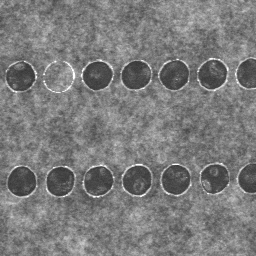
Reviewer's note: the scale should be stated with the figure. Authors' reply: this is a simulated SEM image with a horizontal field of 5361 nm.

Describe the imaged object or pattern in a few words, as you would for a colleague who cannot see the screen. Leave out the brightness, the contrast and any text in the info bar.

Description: a regular array of raised bodies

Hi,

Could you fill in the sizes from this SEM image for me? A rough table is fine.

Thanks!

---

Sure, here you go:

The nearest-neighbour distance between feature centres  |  0.8 micrometres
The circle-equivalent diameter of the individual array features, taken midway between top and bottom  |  30.3 pixels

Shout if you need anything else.